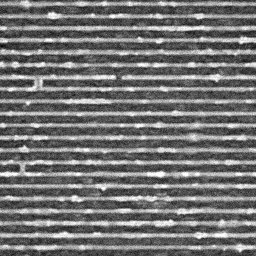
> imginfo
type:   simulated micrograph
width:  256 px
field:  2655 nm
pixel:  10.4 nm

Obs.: parallel lines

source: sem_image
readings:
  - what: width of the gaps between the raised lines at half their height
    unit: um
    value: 0.0972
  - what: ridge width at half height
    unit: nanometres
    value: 29.8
